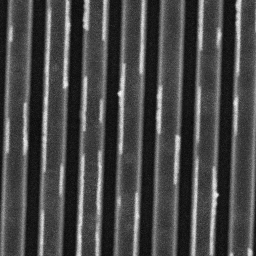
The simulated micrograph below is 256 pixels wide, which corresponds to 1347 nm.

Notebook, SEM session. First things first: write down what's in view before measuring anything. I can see parallel lines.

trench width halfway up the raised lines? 80.8 nm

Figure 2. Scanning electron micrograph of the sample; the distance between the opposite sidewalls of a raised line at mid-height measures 0.121 microns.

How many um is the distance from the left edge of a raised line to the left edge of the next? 0.2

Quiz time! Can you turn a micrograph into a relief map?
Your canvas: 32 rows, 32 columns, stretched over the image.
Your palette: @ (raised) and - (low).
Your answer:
-@@@--@@@--@@--@@@--@@@--@@@-@@@
-@@@--@@@-@@@--@@@--@@@--@@@--@@
-@@@--@@@-@@@--@@@--@@@--@@@--@@
-@@@--@@@-@@@--@@@--@@@--@@@--@@
-@@@--@@@--@@--@@@--@@@--@@@--@@
-@@@--@@@--@@--@@@--@@@--@@---@@
-@@@--@@@--@@--@@@--@@@--@@---@@
-@@@--@@--@@@--@@@--@@@--@@---@@
-@@@--@@--@@@--@@@--@@@--@@---@@
-@@@--@@--@@@--@@@--@@@--@@--@@@
-@@@--@@--@@@--@@@--@@@--@@--@@@
-@@@--@@--@@@--@@@--@@@--@@--@@@
-@@---@@--@@@--@@@--@@@--@@--@@@
-@@--@@@--@@@--@@@--@@@--@@--@@@
-@@--@@@--@@@--@@@--@@---@@--@@@
-@@--@@@--@@@--@@@--@@--@@@--@@@
-@@--@@@--@@@--@@@--@@--@@@--@@@
-@@--@@@--@@@--@@@--@@@-@@@--@@@
-@@--@@@--@@@--@@@--@@--@@@--@@@
-@@--@@@--@@@--@@---@@--@@@--@@@
-@@--@@@--@@@--@@--@@@--@@@--@@@
@@@--@@@--@@@--@@--@@@--@@@--@@@
@@@--@@@--@@@--@@---@@--@@@--@@@
@@@--@@@--@@@--@@--@@@--@@@--@@@
@@@--@@@--@@@--@@--@@@--@@@--@@@
@@@--@@@--@@@--@@--@@@--@@@--@@@
@@@--@@@--@@@--@@--@@@--@@@--@@@
@@@--@@@--@@@--@@--@@@--@@@--@@@
@@@--@@@--@@--@@@--@@@--@@@--@@@
@@@--@@@--@@--@@@--@@@--@@@--@@@
@@@--@@@--@@--@@@--@@@--@@@--@@-
@@@--@@@--@@--@@@--@@@--@@@--@@@